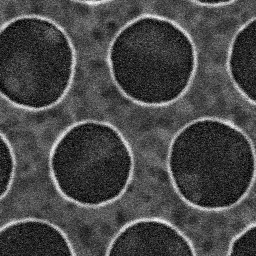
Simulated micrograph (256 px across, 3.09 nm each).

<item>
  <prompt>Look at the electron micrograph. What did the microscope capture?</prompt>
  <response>holes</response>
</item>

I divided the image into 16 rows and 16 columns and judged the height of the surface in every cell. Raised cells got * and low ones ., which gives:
****************
*..*****...****.
....***.....***.
.....**.....**..
.....**.....**..
....***.....***.
*..******.******
****************
****...****....*
.**.....***.....
.**.....***.....
.***....***.....
*****..*****...*
****************
....****...****.
....***.....**..